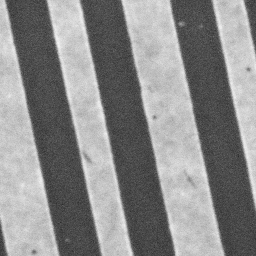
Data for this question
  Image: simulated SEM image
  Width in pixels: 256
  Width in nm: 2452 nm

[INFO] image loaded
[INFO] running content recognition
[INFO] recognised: lines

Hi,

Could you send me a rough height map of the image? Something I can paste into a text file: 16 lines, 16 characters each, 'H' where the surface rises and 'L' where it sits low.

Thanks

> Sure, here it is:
LLLHHLLLHHHLLHHL
HLLHHLLLHHHLLLHH
HLLLHLLLHHHLLLHH
HLLLHHLLHHHLLLHH
HLLLHHLLLHHHLLHH
HLLLHHLLLHHHLLHH
HHLLHHLLLHHHLLLH
HHLLLHHLLHHHLLLH
HHLLLHHLLHHHLLLH
HHLLLHHLLLHHHLLH
HHHLLHHLLLHHHLLH
HHHLLHHLLLHHHLLL
HHHLLLHHLLHHHLLL
HHHLLLHHLLLHHLLL
HHHLLLHHLLLHHHLL
HHHHLLHHLLLHHHLL